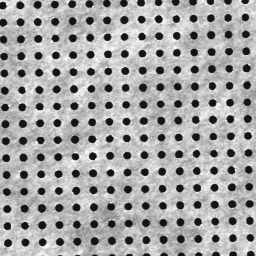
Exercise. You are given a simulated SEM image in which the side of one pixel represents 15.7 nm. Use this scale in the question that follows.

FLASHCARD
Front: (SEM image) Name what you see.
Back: a regular array of holes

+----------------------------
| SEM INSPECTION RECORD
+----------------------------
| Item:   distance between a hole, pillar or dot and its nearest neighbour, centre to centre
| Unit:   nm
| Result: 263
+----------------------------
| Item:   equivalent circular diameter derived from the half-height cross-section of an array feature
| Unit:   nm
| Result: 124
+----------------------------